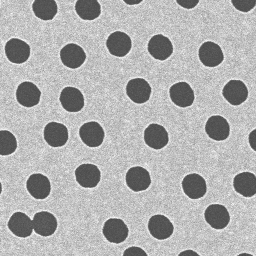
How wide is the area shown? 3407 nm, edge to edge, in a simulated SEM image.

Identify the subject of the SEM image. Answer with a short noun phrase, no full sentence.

a regular array of holes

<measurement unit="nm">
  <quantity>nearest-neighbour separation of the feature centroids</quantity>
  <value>580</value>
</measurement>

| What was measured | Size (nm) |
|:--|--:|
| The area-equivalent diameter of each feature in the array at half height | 340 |